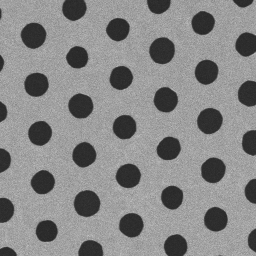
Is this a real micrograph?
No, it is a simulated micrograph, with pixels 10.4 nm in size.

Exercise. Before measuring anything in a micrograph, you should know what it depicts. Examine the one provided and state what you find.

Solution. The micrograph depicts a regular array of holes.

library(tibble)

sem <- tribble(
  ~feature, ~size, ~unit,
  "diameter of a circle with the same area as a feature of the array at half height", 252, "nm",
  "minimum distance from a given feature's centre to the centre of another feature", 510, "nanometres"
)